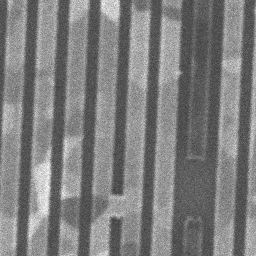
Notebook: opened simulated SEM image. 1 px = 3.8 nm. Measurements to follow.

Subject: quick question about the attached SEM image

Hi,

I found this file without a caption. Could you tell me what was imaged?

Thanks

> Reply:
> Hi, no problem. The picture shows parallel lines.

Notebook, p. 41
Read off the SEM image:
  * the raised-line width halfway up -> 64.1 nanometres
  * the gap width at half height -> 53.7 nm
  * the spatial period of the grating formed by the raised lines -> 118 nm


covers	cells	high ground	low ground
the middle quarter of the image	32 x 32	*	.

.****....****....****...*****...
.****....****....****...*****...
.****....****...*****...*****...
.****....****...*****...****....
.****....****...****....****....
.****....****...*****...****....
.****....****...*****...****....
.****....****...****....****....
.****...*****...****....****....
.****...*****...****....****....
.****...*****...****....****....
.****...*****...****....****....
.****...*****...****....****....
.****...****....****....****...*
****....****....****....****...*
****....****....****....****...*
****....****....****....****...*
*****...****....****....****...*
*****...****....****....****...*
****....****....****...*****...*
****....****....****...*****...*
****....****....****...*****...*
****....****....****...*****...*
****....****....****...****.....
****....****....****...****.....
****....****...*****...****.....
****....****...****....****.....
****....****...****....****.....
****....****...****....****.....
****....****...****....****.....
****....****...****....****.....
****...*****...****....****.....